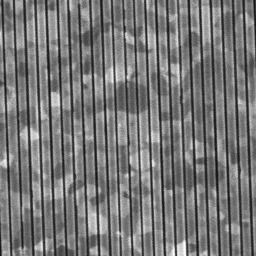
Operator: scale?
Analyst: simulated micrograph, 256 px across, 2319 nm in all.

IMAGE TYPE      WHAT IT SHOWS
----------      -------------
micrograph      parallel lines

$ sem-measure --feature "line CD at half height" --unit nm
70.2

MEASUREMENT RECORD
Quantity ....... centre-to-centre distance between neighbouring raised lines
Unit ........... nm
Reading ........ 99.2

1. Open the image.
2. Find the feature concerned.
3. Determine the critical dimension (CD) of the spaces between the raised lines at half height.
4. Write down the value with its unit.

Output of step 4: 23.8 nm